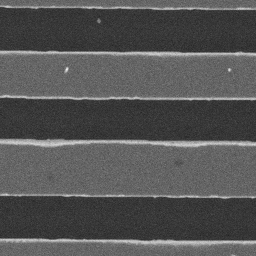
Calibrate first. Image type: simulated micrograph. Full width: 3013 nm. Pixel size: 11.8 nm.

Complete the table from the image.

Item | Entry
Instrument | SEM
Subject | lines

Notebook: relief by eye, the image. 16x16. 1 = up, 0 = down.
0010011111111111
0000000000000000
0000000000000000
1111111111111111
1111111111111111
1111111111111111
0000000000000000
0000000000000000
0000000000000000
1111111111111111
1111111111111111
1111111111111111
0000000000000000
0000000000000000
0000000000000000
1111111111111111